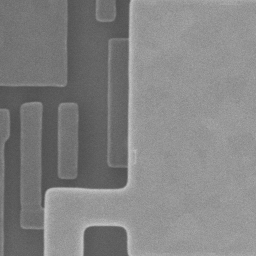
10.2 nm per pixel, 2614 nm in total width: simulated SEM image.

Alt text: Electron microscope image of wiring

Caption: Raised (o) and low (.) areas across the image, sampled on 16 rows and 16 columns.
........oooooooo
........oooooooo
........oooooooo
........oooooooo
........oooooooo
........oooooooo
........oooooooo
........oooooooo
........oooooooo
........oooooooo
........oooooooo
........oooooooo
...ooooooooooooo
...ooooooooooooo
...oo...oooooooo
...oo...oooooooo